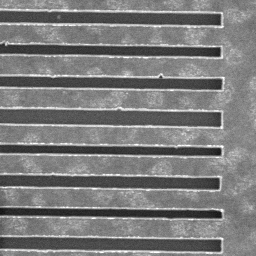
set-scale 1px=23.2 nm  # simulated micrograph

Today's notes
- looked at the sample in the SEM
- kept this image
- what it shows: parallel lines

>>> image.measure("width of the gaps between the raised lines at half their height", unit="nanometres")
287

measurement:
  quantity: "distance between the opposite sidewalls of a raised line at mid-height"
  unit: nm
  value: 481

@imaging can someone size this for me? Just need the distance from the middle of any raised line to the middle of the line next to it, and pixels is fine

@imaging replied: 32.1